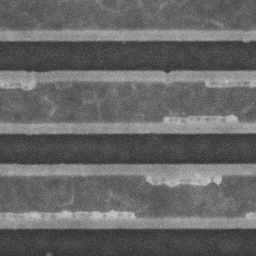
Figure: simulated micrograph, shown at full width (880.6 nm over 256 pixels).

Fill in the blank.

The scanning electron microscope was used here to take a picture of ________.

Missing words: one or a few lines or trenches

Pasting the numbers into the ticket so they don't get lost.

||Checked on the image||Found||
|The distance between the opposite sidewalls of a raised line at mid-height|0.181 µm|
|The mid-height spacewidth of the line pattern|141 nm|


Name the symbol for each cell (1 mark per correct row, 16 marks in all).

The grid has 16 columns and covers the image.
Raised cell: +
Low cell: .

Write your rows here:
++++++++++++++++
++++++++++++++++
................
................
................
++++++++++++++++
++++++++++++++++
++++++++++++++++
................
................
................
++++++++++++++++
++++++++++++++++
++++++++++++++++
................
................